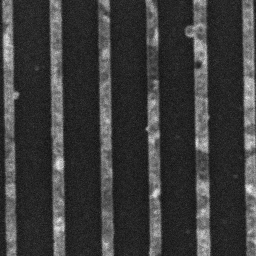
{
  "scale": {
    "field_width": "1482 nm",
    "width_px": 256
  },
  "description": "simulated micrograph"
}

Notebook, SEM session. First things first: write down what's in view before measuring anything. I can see parallel lines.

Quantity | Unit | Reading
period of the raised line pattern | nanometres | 279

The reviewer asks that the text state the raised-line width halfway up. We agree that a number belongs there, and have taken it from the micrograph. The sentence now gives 55.7 nm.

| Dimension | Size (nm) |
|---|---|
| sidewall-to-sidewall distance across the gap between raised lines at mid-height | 218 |